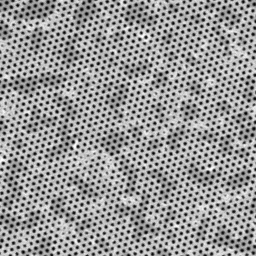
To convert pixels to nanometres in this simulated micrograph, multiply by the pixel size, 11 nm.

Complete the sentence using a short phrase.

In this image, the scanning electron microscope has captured a regular array of holes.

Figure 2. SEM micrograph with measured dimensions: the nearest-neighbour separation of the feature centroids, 69.5 nanometres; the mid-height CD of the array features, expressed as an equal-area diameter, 41.2 nm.